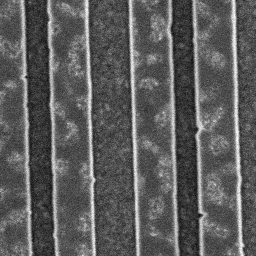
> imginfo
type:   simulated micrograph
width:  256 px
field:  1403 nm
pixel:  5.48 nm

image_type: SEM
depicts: one or a few lines or trenches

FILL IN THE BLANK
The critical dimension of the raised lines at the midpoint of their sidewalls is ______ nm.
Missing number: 219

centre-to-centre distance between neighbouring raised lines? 0.4 µm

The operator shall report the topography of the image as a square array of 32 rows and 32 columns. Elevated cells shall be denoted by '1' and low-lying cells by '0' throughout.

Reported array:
11100011111000001111100011111000
11100011111000001111100011111000
11100011111000001111100011111000
11100011111000001111100011111000
11100011111000001111100011111000
11100011111000001111100011111000
11100011111000001111100011111000
11100011111000000111100011111000
11100011111000001111110011111000
11100011111000001111110011111100
11100011111000000111110001111100
11100011111000000111110001111100
11100011111000000111110001111100
11100011111000000111110001111100
11100011111000000111110001111100
11100001111000000111110001111100
11100001111000000111110001111100
11100001111000000111110001111100
11100001111000000111110001111100
11110001111000000111110001111100
11100001111000000111110001111100
11110001111000000111110001111100
11110001111100000111110001111100
11110001111100000111110001111100
11110001111100000111110001111100
11110001111100000111110001111100
11110001111100000111110001111100
11110001111100000111110001111100
11110001111100000111110001111100
11110001111100000111110001111100
11110001111100000111110001111100
11110001111100000111110001111100